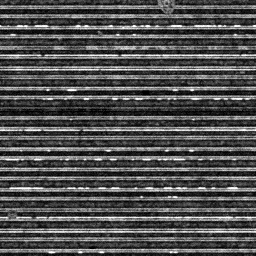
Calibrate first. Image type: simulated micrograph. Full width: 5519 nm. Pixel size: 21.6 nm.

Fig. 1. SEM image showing parallel lines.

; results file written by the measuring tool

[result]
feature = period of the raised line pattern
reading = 218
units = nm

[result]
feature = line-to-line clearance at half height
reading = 168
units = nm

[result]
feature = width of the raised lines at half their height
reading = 2.88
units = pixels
